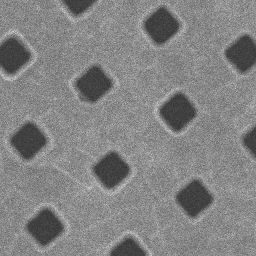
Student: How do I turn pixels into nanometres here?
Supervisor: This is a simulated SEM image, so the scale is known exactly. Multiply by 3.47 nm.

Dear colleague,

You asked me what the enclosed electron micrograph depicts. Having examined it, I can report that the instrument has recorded holes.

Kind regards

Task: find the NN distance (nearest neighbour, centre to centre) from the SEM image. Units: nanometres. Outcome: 303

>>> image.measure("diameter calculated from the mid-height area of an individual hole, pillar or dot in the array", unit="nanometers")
123